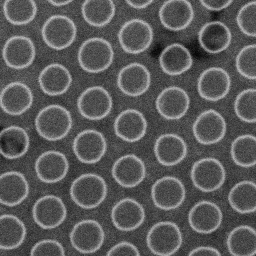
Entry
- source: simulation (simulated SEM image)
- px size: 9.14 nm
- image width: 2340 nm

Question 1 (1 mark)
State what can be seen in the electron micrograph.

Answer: a regular array of raised bodies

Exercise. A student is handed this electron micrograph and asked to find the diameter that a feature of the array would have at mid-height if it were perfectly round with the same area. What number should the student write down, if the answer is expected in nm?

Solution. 284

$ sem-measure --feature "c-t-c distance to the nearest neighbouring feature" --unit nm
397